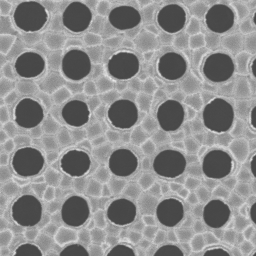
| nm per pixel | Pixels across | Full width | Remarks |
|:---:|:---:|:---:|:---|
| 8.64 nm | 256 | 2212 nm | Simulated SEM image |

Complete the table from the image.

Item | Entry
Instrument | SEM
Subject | a regular array of holes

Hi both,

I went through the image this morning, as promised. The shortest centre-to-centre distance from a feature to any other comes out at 46.9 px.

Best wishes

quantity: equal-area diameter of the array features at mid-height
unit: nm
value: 252